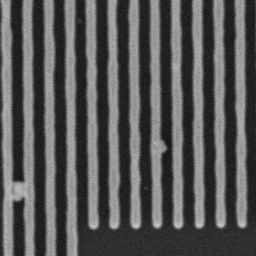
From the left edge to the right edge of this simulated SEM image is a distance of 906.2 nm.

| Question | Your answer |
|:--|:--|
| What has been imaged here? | groups of lines, slits or small figures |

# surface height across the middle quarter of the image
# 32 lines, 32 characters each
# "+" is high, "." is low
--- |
.++...++...++...+++...++...++...
.++...++...++...+++...++...++...
.++...++...++....++...++...++...
.++...++...++....++...++...++...
.++...++...++....++...++...++...
.++...++...++....++...++...++...
.++...++...++....++...++...++...
.++...++...++....++...++...++...
.++...++...++....++...++...+++..
.++...++...++....++...++...+++..
.++...++...++....++...++...+++..
.++...++....++...++...++...+++..
.++...++....++...++...++...+++..
.++...++...+++...++...++...++...
.++...++...++....++...++...++...
.++...++...++....++...++...++...
.++...++...++....++...++...+++..
.++...++...++....++...++...+++..
.++...++...+++...++...++...+++..
.++...++...+++...++...+++..+++..
.++...++...+++...++...+++..+++..
.++...++....++...++...++++.++...
.++...++....++...++...+++..++...
.++...++....++...++...++...+++..
.++...++....++...++...++...+++..
.++...++....++...++...++...+++..
.++...++....++...++...++...++...
.++...++...+++...++...++....++..
.++...++...+++...++...++....++..
.++...++...+++...++...++....++..
.++...++...+++...++...++....++..
.++...++....++...++...++....++..